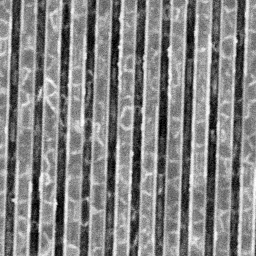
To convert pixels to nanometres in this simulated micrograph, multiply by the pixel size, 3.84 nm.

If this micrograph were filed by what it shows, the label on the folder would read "parallel lines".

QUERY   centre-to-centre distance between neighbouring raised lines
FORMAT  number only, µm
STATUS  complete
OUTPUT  0.096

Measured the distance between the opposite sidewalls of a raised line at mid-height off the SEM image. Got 0.0581 µm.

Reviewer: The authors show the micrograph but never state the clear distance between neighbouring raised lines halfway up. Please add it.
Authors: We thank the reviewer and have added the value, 39.9 nanometers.